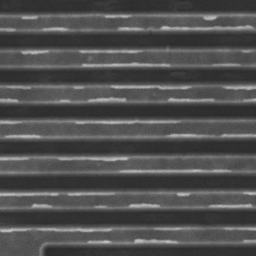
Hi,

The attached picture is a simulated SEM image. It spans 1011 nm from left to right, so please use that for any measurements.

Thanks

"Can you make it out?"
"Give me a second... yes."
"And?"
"parallel lines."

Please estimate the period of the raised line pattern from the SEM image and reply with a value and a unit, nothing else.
35.5 px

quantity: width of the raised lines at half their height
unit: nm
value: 78.9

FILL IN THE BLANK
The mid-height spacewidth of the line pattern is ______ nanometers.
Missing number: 60.7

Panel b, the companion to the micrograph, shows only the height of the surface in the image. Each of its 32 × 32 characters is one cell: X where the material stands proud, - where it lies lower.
--------------------------------
--------------------------------
XXXXXXXXXXXXXXXXXXXXXXXXXXXXXXXX
XXXXXXXXXXXXXXXXXXXXXXXXXXXXXXXX
--------------------------------
--------------------------------
XXXXXXXXXXXXXXXXXXXXXXXXXXXXXXXX
XXXXXXXXXXXXXXXXXXXXXXXXXXXXXXXX
XXXXXXXXXXXX--------------------
--------------------------------
---------------------XXXXXXXXXXX
XXXXXXXXXXXXXXXXXXXXXXXXXXXXXXXX
XXXXXXXXXXXXXXXXXXXXXXXXXXXXXXXX
--------------------------------
--------------------------------
XXXXXXXXXXXXXXXXXXXXXXXXXXXXXXXX
XXXXXXXXXXXXXXXXXXXXXXXXXXXXXXXX
--------------------------------
--------------------------------
---------XXXXXXXXXXXXXXXXXXXXXXX
XXXXXXXXXXXXXXXXXXXXXXXXXXXXXXXX
XXXXXXXXXXXXXXXXXXXXXXXXXXXXXXXX
--------------------------------
--------------------------------
XXXXXXXXXXXXXXXXXXXXXXXXXXXXXXXX
XXXXXXXXXXXXXXXXXXXXXXXXXXXXXXXX
--------------------------------
--------------------------------
XXXXXXXXXXXXXXXXXXXXXXXXXXXXXXXX
XXXXXXXXXXXXXXXXXXXXXXXXXXXXXXXX
XXXXXXXXXXXXXXXXXXXXXXXXXXXXXXXX
XXXXX---------------------------